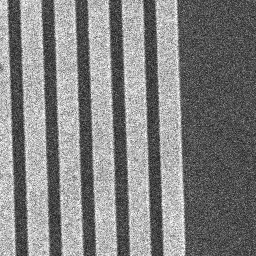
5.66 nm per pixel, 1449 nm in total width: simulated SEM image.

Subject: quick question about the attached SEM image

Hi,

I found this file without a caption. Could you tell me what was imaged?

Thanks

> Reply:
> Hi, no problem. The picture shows parallel lines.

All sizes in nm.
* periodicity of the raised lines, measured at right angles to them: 191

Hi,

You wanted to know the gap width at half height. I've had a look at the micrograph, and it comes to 75 nanometres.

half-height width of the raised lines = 118 nanometers